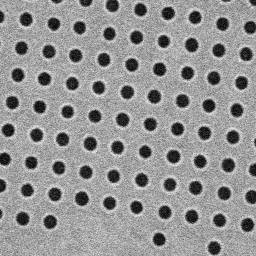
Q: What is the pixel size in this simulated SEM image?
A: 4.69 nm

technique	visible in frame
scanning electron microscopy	a regular array of holes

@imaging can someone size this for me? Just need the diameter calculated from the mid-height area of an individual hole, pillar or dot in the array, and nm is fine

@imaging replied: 67.8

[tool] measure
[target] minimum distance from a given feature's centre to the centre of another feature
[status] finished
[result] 128 nanometres